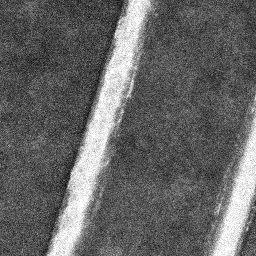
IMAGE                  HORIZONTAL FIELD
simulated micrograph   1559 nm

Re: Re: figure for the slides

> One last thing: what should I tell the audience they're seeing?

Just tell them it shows one or a few lines or trenches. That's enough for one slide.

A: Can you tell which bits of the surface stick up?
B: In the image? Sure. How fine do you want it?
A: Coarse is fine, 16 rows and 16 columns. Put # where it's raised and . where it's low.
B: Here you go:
.........#######
........########
........########
........########
.......#########
.......#########
.......#########
.......#########
......##########
......##########
......##########
.....##########.
.....##########.
.....##########.
....##########..
....##########..